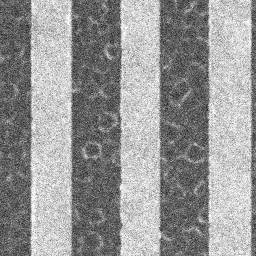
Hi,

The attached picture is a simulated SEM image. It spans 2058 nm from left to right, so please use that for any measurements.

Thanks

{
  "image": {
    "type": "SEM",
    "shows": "one or a few lines or trenches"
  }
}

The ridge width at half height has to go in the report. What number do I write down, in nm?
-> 318